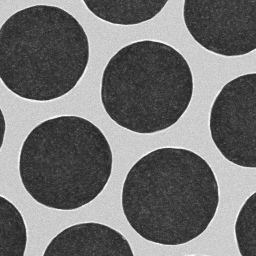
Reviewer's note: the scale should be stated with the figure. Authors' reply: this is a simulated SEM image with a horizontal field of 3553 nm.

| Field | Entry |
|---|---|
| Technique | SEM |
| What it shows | holes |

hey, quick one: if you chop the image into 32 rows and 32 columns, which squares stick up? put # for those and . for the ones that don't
###########..........##.........
##......###.........###.........
#.........###.....#####.........
..........#############.........
...........#############........
...........#####.....####.......
...........####.......#####....#
...........###.........#########
...........##...........########
..........###...........######..
#.........###...........####....
##......#####...........###.....
####..#######...........###.....
#############..........###......
##############.........###......
.####.......###.......####......
.###.........####..#######......
###..........##############.....
###...........#############.....
###...........####.......###....
##............###.........###...
##............##...........#####
###..........###...........#####
###..........##............#####
####........###............####.
.####......####............####.
..#############............###..
...#############..........####..
...#####......###.........###...
...####........###.......####...
...###..........####...#######..
...###...........#############..